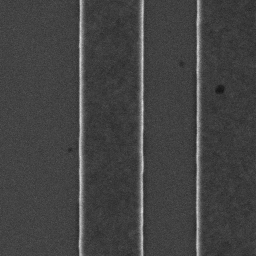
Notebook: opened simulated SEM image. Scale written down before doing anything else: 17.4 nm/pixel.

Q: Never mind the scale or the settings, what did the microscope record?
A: wiring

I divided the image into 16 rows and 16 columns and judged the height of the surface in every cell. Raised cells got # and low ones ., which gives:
.....####...####
.....####...####
.....####...####
.....####...####
.....####...####
.....####...####
.....####...####
.....####...####
.....####...####
.....####...####
.....####...####
.....####...####
.....####...####
.....####...####
.....####...####
.....####...####